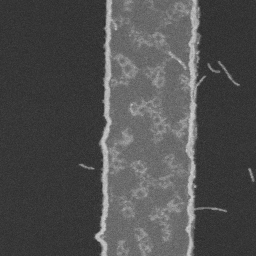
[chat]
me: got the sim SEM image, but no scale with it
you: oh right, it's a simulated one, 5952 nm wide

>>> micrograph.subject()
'one or a few lines or trenches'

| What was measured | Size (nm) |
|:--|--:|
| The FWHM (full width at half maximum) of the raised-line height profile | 1990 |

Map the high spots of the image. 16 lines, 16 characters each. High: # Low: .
.......#####....
.......#####....
.......#####....
.......#####....
.......#####....
.......#####....
.......#####....
.......#####....
.......#####....
.......#####....
.......#####....
.......#####....
.......#####....
.......#####....
......######....
......######....